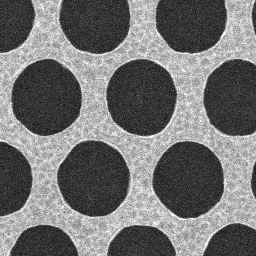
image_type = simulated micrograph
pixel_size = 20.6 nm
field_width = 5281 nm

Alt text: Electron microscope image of holes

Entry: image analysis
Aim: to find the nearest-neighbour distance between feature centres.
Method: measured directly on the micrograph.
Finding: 1.94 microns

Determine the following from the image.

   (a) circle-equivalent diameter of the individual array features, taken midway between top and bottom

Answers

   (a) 1530 nm